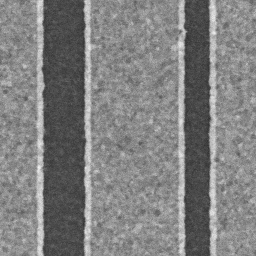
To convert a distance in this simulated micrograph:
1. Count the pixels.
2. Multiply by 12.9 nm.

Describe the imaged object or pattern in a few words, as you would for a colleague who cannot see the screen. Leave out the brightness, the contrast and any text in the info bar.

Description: one or a few lines or trenches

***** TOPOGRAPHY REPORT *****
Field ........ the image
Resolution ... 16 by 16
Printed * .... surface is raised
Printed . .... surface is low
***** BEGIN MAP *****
***..******..***
***..******..***
***..******..***
***...*****..***
***..******..***
***..******..***
***..******..***
***..******..***
***...*****..***
***...*****..***
***..******..***
***..******..***
***...*****..***
***..******..***
***..******..***
***..******..***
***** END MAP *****